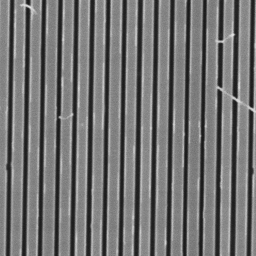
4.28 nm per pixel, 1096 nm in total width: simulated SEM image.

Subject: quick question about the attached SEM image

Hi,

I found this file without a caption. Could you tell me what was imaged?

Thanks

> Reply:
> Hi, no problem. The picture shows parallel lines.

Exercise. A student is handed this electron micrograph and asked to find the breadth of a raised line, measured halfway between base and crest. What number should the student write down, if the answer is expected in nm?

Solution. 49.7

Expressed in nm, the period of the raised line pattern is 68.7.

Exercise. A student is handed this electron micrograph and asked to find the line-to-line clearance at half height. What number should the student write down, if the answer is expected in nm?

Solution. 20.8